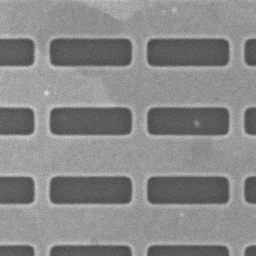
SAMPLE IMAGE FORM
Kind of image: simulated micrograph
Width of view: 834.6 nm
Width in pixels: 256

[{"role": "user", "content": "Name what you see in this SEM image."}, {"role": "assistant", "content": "groups of lines, slits or small figures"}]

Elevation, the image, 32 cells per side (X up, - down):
XXXXXXXXXXXXXXXXXXXXXXXXXXXXXXXX
XXXXXXXXXXXXXXXXXXXXXXXXXXXXXXXX
XXXXXXXXXXXXXXXXXXXXXXXXXXXXXXXX
XXXXXXXXXXXXXXXXXXXXXXXXXXXXXXXX
XXXXXXXXXXXXXXXXXXXXXXXXXXXXXXXX
----XX-----------X-----------XX-
----XX-----------X-----------X--
----XX----------XX-----------XX-
XXXXXXXXXXXXXXXXXXXXXXXXXXXXXXXX
XXXXXXXXXXXXXXXXXXXXXXXXXXXXXXXX
XXXXXXXXXXXXXXXXXXXXXXXXXXXXXXXX
XXXXXXXXXXXXXXXXXXXXXXXXXXXXXXXX
XXXXXXXXXXXXXXXXXXXXXXXXXXXXXXXX
----XXX---------XXX---------XXX-
----XX-----------X-----------X--
----XX-----------X-----------X--
----XX----------XX-----------XX-
XXXXXXXXXXXXXXXXXXXXXXXXXXXXXXXX
XXXXXXXXXXXXXXXXXXXXXXXXXXXXXXXX
XXXXXXXXXXXXXXXXXXXXXXXXXXXXXXXX
XXXXXXXXXXXXXXXXXXXXXXXXXXXXXXXX
XXXXXXXXXXXXXXXXXXXXXXXXXXXXXXXX
----XX----------XX-----------XX-
----XX-----------X-----------X--
----XX-----------X-----------XX-
----XXX---------XXX---------XXX-
XXXXXXXXXXXXXXXXXXXXXXXXXXXXXXXX
XXXXXXXXXXXXXXXXXXXXXXXXXXXXXXXX
XXXXXXXXXXXXXXXXXXXXXXXXXXXXXXXX
XXXXXXXXXXXXXXXXXXXXXXXXXXXXXXXX
XXXXXXXXXXXXXXXXXXXXXXXXXXXXXXXX
----XX----------XX-----------XX-